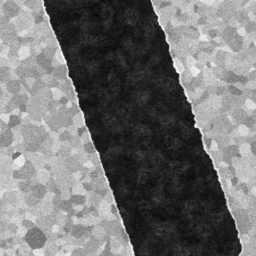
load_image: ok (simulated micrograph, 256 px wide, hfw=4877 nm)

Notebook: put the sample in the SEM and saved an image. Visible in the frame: one or a few lines or trenches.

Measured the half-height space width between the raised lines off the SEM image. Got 1980 nm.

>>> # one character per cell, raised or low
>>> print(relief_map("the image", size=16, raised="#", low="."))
###.......######
###.......######
####......######
####.......#####
####.......#####
#####......#####
#####.......####
#####.......####
######.......###
######.......###
######.......###
#######.......##
#######.......##
########.......#
########.......#
########.......#